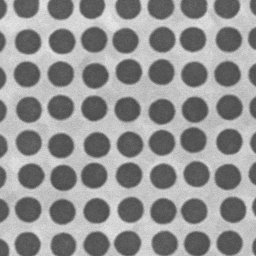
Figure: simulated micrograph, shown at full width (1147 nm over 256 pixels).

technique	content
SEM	a regular array of holes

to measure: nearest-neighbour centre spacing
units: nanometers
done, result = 143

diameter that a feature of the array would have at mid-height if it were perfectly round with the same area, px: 27.2